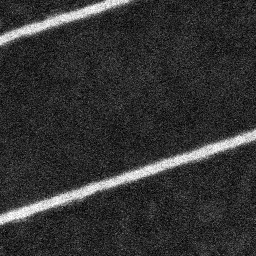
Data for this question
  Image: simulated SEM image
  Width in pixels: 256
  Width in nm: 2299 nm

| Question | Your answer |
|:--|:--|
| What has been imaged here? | one or a few lines or trenches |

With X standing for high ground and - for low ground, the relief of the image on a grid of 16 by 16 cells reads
------XXXXXXXXXX
---XXXXXXXXXXXXX
XXXXXXXXXXXXXXXX
XXXXXXXXXXXXXXXX
XXXXXXXXXXXXXXXX
XXXXXXXXXXXXXXXX
XXXXXXXXXXXXXXXX
XXXXXXXXXXXXXXXX
XXXXXXXXXXXXXXXX
XXXXXXXXXXXXX---
XXXXXXXXXX------
XXXXXXX---------
XXXX------------
X---------------
----------------
----------------